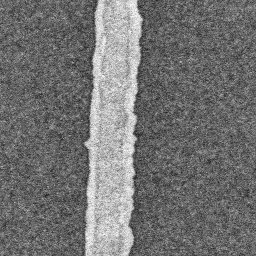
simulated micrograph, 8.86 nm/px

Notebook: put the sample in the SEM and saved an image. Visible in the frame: one or a few lines or trenches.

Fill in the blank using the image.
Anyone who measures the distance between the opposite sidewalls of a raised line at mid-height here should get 325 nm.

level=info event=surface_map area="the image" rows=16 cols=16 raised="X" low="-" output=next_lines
------XX--------
------XX--------
------XX--------
------XX--------
------XX--------
------XX--------
------XX--------
------XX--------
------XX--------
------XX--------
------XX--------
------XX--------
------XX--------
------XX--------
------XX--------
------XX--------